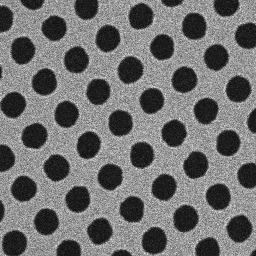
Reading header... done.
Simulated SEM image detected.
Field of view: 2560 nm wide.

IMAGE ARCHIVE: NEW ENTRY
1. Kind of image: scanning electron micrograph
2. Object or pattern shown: a regular array of holes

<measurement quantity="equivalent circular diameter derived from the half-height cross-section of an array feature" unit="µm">0.264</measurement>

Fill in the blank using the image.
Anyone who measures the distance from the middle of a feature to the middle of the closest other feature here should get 383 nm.